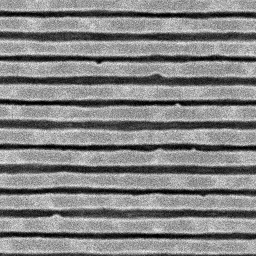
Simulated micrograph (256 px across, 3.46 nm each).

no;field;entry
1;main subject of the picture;parallel lines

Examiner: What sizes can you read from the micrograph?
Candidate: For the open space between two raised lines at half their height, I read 23.8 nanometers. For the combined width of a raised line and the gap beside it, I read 76.4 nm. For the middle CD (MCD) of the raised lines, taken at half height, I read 49.7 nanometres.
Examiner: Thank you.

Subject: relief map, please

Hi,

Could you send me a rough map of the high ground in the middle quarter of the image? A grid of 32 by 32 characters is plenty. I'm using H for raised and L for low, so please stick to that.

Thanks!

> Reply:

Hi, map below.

HHHHHHHHHHHHHHHHHHHHHHHHHHHHHHHH
HHHHHHHHHHHHHHHHHHHHHHHHHHHHHHHH
HHHHHHHHHHHHHHHHHHHHHHLLHHHHHHHH
LLLLLLLLLLLLLLLLLLLLLLLLLLLLLLLL
LLLLLLLLLLLLLLLLLLLLLLLLLLLLLLLL
HHHHHHHHHHHHHHHHHHHLLLLHHLLLLLLL
HHHHHHHHHHHHHHHHHHHHHHHHHHHHHHHH
HHHHHHHHHHHHHHHHHHHHHHHHHHHHHHHH
HHHHHHHHHHHHHHHHHHHHHHHHHHHHHHHH
LLLLLLLLLLLLLLLLLLLLLLLLLLLLLLLL
LLLLLLLLLLLLLLLLLLLLLLHHHHHHHLLL
HHHHHHHHHHHHHHHHHHHHHHHHHHHHHHHH
HHHHHHHHHHHHHHHHHHHHHHHHHHHHHHHH
HHHHHHHHHHHHHHHHHHHHHHHHHHHHHHHH
LLLLLLLLLLLLLLLLLLLLLLLLLLLLLLLL
LLLLLLLLLLLLLLLLLLLLLLLLLLLLLLLL
HHHHHHHHHHLLLLLLLLLLLLLLLLLLLLLL
HHHHHHHHHHHHHHHHHHHHHHHHHHHHHHHH
HHHHHHHHHHHHHHHHHHHHHHHHHHHHHHHH
HHHHHHHHHHHHHHHHHHHHHHHHHHHHHHHH
LLLLLLLLLLLLLLLLLLLLLLLLLLLLLLLL
LLLLLLLLLLLLLLLLLLLLLLLHHLLLLLLL
HHHHHHHHHHHHHHHHHHHHHHHHHHHHHHHH
HHHHHHHHHHHHHHHHHHHHHHHHHHHHHHHH
HHHHHHHHHHHHHHHHHHHHHHHHHHHHHHHH
LLLLLLHHLLLLLLLLLLLLLLLLLLLLLLLL
LLLLLLLLLLLLLLLLLLLLLLLLLLLLLLLL
HHHHHHHHHHHHHHHHHLLLLLLLLLLLLLLL
HHHHHHHHHHHHHHHHHHHHHHHHHHHHHHHH
HHHHHHHHHHHHHHHHHHHHHHHHHHHHHHHH
HHHHHHHHHHHHHHHHHHHHHHHHHHHHHHHH
LLLLLLLLLLLLLLLLLLLLLLLLLLLLLLLL